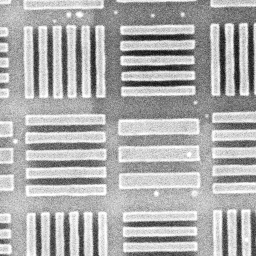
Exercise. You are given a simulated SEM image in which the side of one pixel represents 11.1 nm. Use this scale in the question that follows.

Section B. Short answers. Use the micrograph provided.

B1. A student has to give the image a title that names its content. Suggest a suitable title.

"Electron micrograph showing groups of lines, slits or small figures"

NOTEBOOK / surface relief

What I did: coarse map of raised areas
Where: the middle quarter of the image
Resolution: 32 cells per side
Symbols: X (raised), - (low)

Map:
-XX--X--XX----------------------
-XX--X--XX----------------------
-XX--X--XX-----XXXXXXXXXXXXXXXXX
-XX--X--XX-----XXXXXXXXXXXXXXXXX
-XX--X--XX----------------------
-XX--X--XX----------------------
-XX--X--XX-----XXXXXXXXXXXXXXXXX
-XX--X--XX-----XXXXXXXXXXXXXXXX-
--------------------------------
--------------------------------
--------------------------------
--------------------------------
--------------------------------
XXXXXXXXXX----------------------
XXXXXXXXXX----XXXXXXXXXXXXXXXXXX
--------------XXXXXXXXXXXXXXXXXX
--------------XXXXXXXXXXXXXXXXXX
XXXXXXXXXX----XXXXXXXX----------
XXXXXXXXXX----------------------
--------------------------------
--------------------------------
-------XXX----XXXXXXXXXXXXXXXXXX
XXXXXXXXXX----XXXXXXXXXXXXXXXXXX
XXXXXXXXXX----XXXXXXXXXXXXXXXXXX
--------------------------------
--------------------------------
XXXXXXXXXX----------------------
XXXXXXXXXX-----XXXXXXXXXXXXXXXXX
--------------XXXXXXXXXXXXXXXXXX
--------------XXXXXXXXXXXXXXXXXX
-XXXXXXXXX----XXXXXXXXXXXXXXXXXX
XXXXXXXXXX----------------------